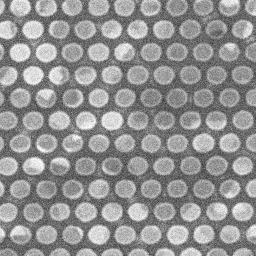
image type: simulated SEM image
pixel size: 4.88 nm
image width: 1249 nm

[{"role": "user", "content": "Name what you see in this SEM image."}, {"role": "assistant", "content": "a regular array of raised bodies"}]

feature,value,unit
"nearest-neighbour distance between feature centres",126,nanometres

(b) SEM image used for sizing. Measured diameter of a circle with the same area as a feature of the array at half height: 87.4 nm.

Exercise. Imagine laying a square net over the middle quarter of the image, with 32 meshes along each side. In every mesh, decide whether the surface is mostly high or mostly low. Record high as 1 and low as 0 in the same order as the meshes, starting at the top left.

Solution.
00000000000000000000000000000000
10001110001111000111000111100011
10011111001111001111100111100111
10011111001111001111100111100111
00001110000110000111000011000011
00000000000000000000000000000000
00000000000000000000000000001000
11110001111001111000111100111110
11111011111001111101111100111110
11110001110001111000111100111100
01100000100000110000010000011000
00000000000000000000000000000000
00001110000111000111000011100011
10011111001111001111100111100111
10011111001111001111100111100111
10001110001111000111000111100011
00000000000000000000000000000000
00000000000000000000000000000000
01110001110000111000111100011100
11111011111001111000111100111110
11110011111001111000111100111110
01110001110000110000111000011100
00000000000000000000000000000000
00000000000000000010000000000001
10011110001111000111000111100011
10011111001111001111100111100111
10011111001111001111000111100011
00000000000000000010000000000000
00000000000000000000000000000000
01100000110000111000011000011100
11110001111001111000111100111100
11110001111001111000111100111110